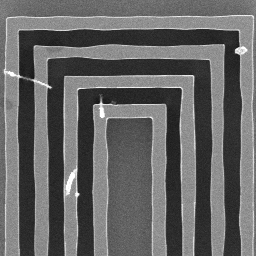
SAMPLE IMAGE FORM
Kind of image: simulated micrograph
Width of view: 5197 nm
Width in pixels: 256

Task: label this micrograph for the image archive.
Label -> groups of lines, slits or small figures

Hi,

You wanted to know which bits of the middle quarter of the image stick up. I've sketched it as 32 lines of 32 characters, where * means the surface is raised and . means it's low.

................................
................................
................................
********************************
********************************
********************************
***...........................**
***...........................**
***...........................**
***...........................**
***....*******************...***
***....*******************...***
***....*******************...***
***....****...........****...***
***.....***...........****...***
***.....**............****...***
***.....**............****...***
***.....**............****...***
***.....**............***....***
***....****...........***....***
***....****...........***....***
***....****...........***....***
***....****...........****...***
***....****...........****...***
***....****...........****...***
***....****...........****...***
***....****...........***....***
***....****...........***....***
***....****...........***....***
***....****...........***....***
***....****...........***.....**
***....****...........***.....**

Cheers